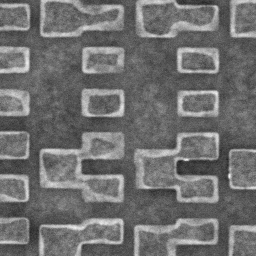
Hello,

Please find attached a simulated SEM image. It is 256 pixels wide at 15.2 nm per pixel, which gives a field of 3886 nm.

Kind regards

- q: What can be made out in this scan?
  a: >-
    wiring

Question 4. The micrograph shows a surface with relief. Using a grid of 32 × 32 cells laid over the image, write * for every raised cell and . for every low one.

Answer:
.....*****........****.......***
***..**********..**********..***
****.**********...*********..***
***..******.......****.......***
...................**...........
................................
***........****........***......
***........****.......*****.....
***........****........****.....
................................
................................
..............*...........*.....
***........****........****.....
***........****........****.....
................................
................................
................................
***........****.......*****.....
***........****.......*****.....
***..********....**********..***
.....*****.......*****.......***
.....*****........****.......***
***..**********...*********..***
***........****.......*****...*.
***........****.......*****.....
................................
................................
.**.............................
***..**********..*...******.....
***..**********..**********..***
.....*****.......*****.......***
.....*****.......****........***